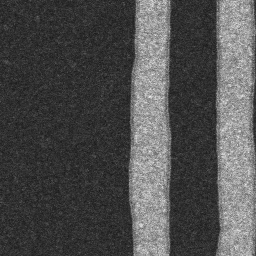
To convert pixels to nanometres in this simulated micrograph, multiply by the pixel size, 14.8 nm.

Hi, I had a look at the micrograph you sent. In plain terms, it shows one or a few lines or trenches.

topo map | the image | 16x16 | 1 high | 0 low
1111111110011100
1111111110011100
1111111100011100
1111111100011100
1111111100011100
1111111100111100
1111111100111100
1111111100011100
1111111100011100
1111111100011100
1111111100011100
1111111100011100
1111111100011100
1111111100011100
1111111100011100
1111111100011100